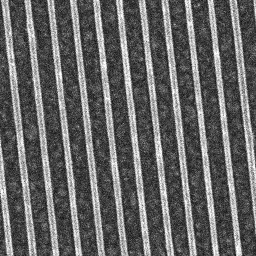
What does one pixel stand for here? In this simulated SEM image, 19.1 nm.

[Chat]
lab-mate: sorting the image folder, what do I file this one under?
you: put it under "parallel lines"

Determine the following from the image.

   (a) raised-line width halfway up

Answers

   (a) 90.1 nanometers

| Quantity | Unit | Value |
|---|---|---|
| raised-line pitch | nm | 434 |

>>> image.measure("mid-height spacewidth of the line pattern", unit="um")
0.342